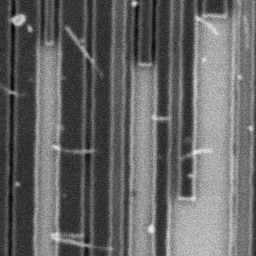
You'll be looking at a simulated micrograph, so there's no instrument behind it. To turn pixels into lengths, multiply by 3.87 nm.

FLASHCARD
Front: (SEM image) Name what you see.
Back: groups of lines, slits or small figures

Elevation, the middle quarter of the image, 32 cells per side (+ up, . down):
+++++..+++++...++......++++..+++
+++++..+++++...++......++++..+++
+++++..+++++...++......++++..+++
+++++..+++++...++......++++..+++
+++++..+++++...++......++++..+++
+++++..+++++...++......++++..+++
+++++..+++++...++......++++..+++
+++++..+++++...++......++++..+++
+++++..+++++...++......++++..+++
+++++..+++++...++......++++..+++
+++++..+++++...++......++++..+++
+++++..+++++...++......++++..+++
+++++..+++++...++......++++..+++
+++++..+++++...++.....+++++..+++
+++++..+++++...++......++++..+++
+++++..+++++...++......++++..+++
+++++..+++++...++......++++..+++
+++++..+++++...++......++++..+++
+++++..+++++...++......++++..+++
+++++..+++++...++......++++..+++
+++++..+++++..+++......++++..+++
++++++++++++..+++......++++..+++
+++++..+++++..+++......+++...+++
+++++..+++++...++......+++...+++
+++++..+++++...++......+++...+++
+++++..+++++...++......+++...+++
+++++..+++++..+++......+++...+++
+++++..+++++..+++......+++...+++
+++++..+++++..+++......+++...+++
+++++..+++++...++......+++...+++
+++++..+++++...++......+++...+++
+++++..+++++..+++......+++...+++